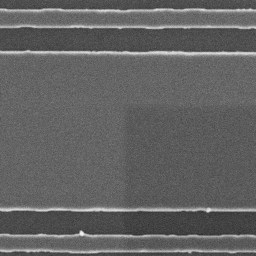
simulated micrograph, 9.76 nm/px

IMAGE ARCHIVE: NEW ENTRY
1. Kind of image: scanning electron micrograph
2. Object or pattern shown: lines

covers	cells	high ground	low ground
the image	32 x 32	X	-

--------------------------------
XXXXXXXXXXXXXXXXXXXXXXXXXXXXXXXX
XXXXXXXXXXXXXXXXXXXXXXXXXXXXXXXX
-----------X--XX--XXX--X-----XXX
--------------------------------
--------------------------------
XXXXXXXXXXX---------------------
XXXXXXXXXXXXXXXXXXXXXXXXXXXXXXXX
XXXXXXXXXXXXXXXXXXXXXXXXXXXXXXXX
XXXXXXXXXXXXXXXXXXXXXXXXXXXXXXXX
XXXXXXXXXXXXXXXXXXXXXXXXXXXXXXXX
XXXXXXXXXXXXXXXXXXXXXXXXXXXXXXXX
XXXXXXXXXXXXXXXXXXXXXXXXXXXXXXXX
XXXXXXXXXXXXXXXXXXXXXXXXXXXXXXXX
XXXXXXXXXXXXXXXXXXXXXXXXXXXXXXXX
XXXXXXXXXXXXXXXXXXXXXXXXXXXXXXXX
XXXXXXXXXXXXXXXXXXXXXXXXXXXXXXXX
XXXXXXXXXXXXXXXXXXXXXXXXXXXXXXXX
XXXXXXXXXXXXXXXXXXXXXXXXXXXXXXXX
XXXXXXXXXXXXXXXXXXXXXXXXXXXXXXXX
XXXXXXXXXXXXXXXXXXXXXXXXXXXXXXXX
XXXXXXXXXXXXXXXXXXXXXXXXXXXXXXXX
XXXXXXXXXXXXXXXXXXXXXXXXXXXXXXXX
XXXXXXXXXXXXXXXXXXXXXXXXXXXXXXXX
XXXXXXXXXXXXXXXXXXXXXXXXXXXXXXXX
XXXXXXXXXXXXXXXXXXXXXXXXXXXXXXXX
--------------------------------
--------------------------------
--------------------------------
XXXXXXXXXXXXXXXXXXXXXX-XX--XXXXX
XXXXXXXXXXXXXXXXXXXXXXXXXXXXXXXX
--------XXXXX---------------XX--